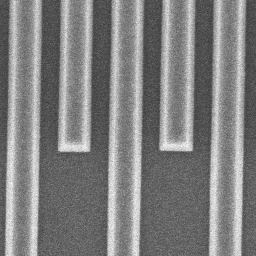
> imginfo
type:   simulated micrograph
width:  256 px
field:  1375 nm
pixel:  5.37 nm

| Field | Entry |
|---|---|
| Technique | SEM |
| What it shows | parallel lines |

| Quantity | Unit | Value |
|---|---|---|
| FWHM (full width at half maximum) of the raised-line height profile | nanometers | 150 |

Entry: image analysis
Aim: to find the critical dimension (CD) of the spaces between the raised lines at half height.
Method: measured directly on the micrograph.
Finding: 123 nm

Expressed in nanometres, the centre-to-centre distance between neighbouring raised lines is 274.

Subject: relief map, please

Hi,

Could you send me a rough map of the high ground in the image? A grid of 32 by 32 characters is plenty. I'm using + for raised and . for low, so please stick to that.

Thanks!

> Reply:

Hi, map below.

.++++...+++...++++...+++...+++..
.++++...+++...++++...+++...+++..
.++++...+++...++++...+++...+++..
.++++...+++...++++...+++...+++..
.++++...+++...++++..++++...+++..
.++++...+++...++++..++++...+++..
.++++...+++...+++...++++...+++..
.++++...+++...++++..++++...+++..
.++++...+++...++++..++++...+++..
.++++...+++...++++..++++...+++..
.++++...+++...++++..++++...+++..
.++++...+++...++++..++++...+++..
.++++...+++...+++...++++...+++..
.++++...+++...+++...++++...+++..
.++++...+++...+++...++++...+++..
.++++...+++...+++...++++...+++..
.++++...+++...+++...++++...+++..
.++++...+++...+++...++++...+++..
.++++...+++...+++.....+....+++..
.++++.........+++..........+++..
.++++.........+++..........+++..
.+++..........+++..........+++..
.+++..........+++..........+++..
.++++.........+++..........+++..
.++++.........+++..........+++..
.++++.........+++..........+++..
.++++.........+++..........+++..
.+++..........+++..........+++..
.+++..........+++..........+++..
.+++..........+++..........+++..
.+++..........+++.........++++..
.+++..........+++.........++++..